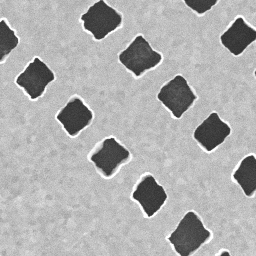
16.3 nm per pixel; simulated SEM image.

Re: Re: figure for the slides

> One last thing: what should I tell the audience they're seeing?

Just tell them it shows holes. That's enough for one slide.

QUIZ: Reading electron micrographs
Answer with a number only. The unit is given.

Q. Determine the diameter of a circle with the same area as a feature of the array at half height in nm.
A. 552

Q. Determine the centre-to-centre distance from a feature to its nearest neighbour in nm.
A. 863